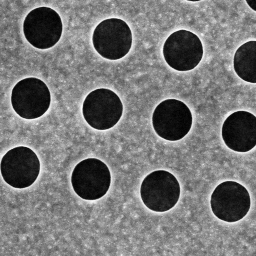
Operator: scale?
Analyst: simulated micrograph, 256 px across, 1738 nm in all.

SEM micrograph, a regular array of holes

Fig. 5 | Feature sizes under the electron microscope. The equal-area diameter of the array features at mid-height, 274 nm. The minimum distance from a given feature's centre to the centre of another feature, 479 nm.